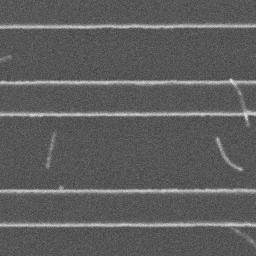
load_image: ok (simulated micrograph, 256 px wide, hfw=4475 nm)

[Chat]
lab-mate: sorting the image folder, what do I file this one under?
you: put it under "lines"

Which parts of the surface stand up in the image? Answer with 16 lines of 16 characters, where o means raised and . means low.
oooooooooooooooo
oooooooooooooooo
................
................
................
oooooooooooooooo
oooooooooooooooo
................
................
................
................
................
oooooooooooooooo
oooooooooooooooo
................
................